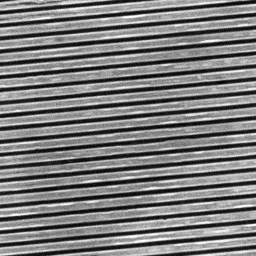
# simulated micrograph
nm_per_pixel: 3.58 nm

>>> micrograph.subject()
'parallel lines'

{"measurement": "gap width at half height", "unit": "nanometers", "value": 16.9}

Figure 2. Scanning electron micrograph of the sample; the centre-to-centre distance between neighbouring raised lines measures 0.046 µm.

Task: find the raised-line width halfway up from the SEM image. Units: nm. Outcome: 29.9